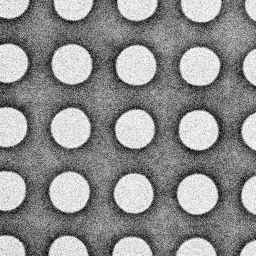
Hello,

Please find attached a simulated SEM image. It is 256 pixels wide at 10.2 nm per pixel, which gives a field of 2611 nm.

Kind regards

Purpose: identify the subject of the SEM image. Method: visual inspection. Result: an array of small figures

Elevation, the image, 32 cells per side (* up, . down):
***....****....*****...*****...*
***....****....****....****....*
........................**......
................................
................................
................................
***....****....****....***.....*
***....****....****....****....*
***....****....****....****...**
***....****....****....****....*
.................*......**......
................................
................................
................................
***....****....****....***.....*
***....****....****....****....*
***....****....****....****...**
***....****....****....****....*
........................**......
................................
................................
................................
***....****....***.....***.....*
***...*****...*****...*****...**
***...*****...*****...*****...**
**.....****....****....****....*
................**......**.....*
................................
................................
................................
***....***.....***.....***.....*
***...*****...*****...*****...**